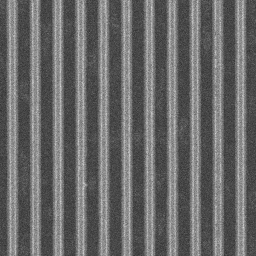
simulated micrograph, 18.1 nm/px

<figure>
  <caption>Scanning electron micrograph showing parallel lines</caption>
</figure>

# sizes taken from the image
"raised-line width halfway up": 136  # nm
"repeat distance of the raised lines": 414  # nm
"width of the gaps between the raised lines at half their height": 274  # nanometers